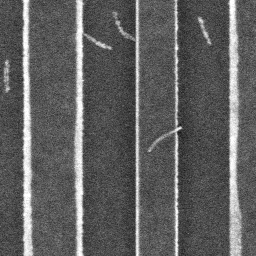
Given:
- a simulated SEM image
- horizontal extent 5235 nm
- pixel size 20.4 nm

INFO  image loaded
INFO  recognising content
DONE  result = lines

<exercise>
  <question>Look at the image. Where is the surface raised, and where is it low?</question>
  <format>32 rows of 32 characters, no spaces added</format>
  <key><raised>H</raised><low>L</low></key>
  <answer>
LLLHHHHHHHLLLLLLLHHHHHLLLLLLLHHH
LLLHHHHHHHLLLLLLLHHHHHLLLLLLLHHH
LLLHHHHHHHLLLLLLLHHHHHLLLLLLLHHH
LLLHHHHHHHLLLLLLLHHHHHLLLLLLLHHH
LLLHHHHHHHLLLLLLLHHHHHLLLLLLLHHH
LLLHHHHHHHLLLLLLLHHHHHLLLLLLLHHH
LLLHHHHHHHLLLLLLLHHHHHLLLLLLLHHH
LLLHHHHHHHLLLLLLLHHHHHLLLLLLLHHH
LLLHHHHHHHLLLLLLLHHHHHLLLLLLLHHH
LLLHHHHHHHLLLLLLLHHHHHLLLLLLLHHH
LLLHHHHHHHLLLLLLLHHHHHLLLLLLLHHH
LLLHHHHHHHLLLLLLLHHHHHLLLLLLLHHH
LLLHHHHHHHLLLLLLLHHHHHLLLLLLLHHH
LLLHHHHHHHLLLLLLLHHHHHLLLLLLLHHH
LLLHHHHHHHLLLLLLLHHHHHLLLLLLLHHH
LLLHHHHHHHLLLLLLLHHHHHLLLLLLLHHH
LLLHHHHHHHLLLLLLLHHHHHLLLLLLLHHH
LLLHHHHHHHLLLLLLLHHHHHLLLLLLLHHH
LLLHHHHHHHLLLLLLLHHHHHLLLLLLLHHH
LLLHHHHHHHLLLLLLLHHHHHLLLLLLLHHH
LLLHHHHHHHLLLLLLLHHHHHLLLLLLLHHH
LLLHHHHHHHLLLLLLLHHHHHLLLLLLLHHH
LLLHHHHHHHLLLLLLLHHHHHLLLLLLLHHH
LLLHHHHHHHLLLLLLLHHHHHLLLLLLLHHH
LLLHHHHHHHLLLLLLLHHHHHLLLLLLLHHH
LLLHHHHHHHLLLLLLLHHHHHLLLLLLLHHH
LLLHHHHHHHLLLLLLLHHHHHLLLLLLLHHH
LLLHHHHHHHLLLLLLLHHHHHLLLLLLLHHH
LLLHHHHHHHLLLLLLLHHHHHLLLLLLLHHH
LLLHHHHHHHLLLLLLLHHHHHLLLLLLLHHH
LLLHHHHHHHLLLLLLLHHHHHLLLLLLLHHH
LLLHHHHHHHLLLLLLLHHHHHLLLLLLLHHH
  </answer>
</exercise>